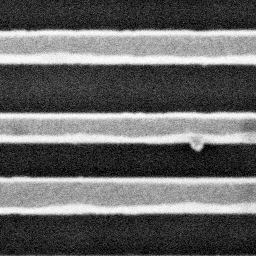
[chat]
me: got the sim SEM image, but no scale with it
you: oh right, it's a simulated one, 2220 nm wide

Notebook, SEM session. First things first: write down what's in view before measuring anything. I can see lines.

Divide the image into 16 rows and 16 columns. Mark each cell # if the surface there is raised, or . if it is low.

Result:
................
................
################
################
................
................
................
################
################
................
................
################
################
................
................
................